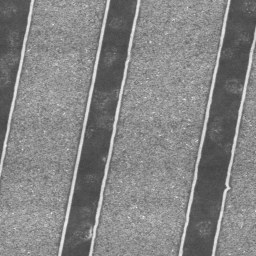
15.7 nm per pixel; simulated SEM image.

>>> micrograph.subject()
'one or a few lines or trenches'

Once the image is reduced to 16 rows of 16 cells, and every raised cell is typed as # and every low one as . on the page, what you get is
##.....##.....##
##....##......##
##....##......##
#.....##......##
#.....##.....###
#.....##.....##.
#.....#......##.
#....##......##.
.....##......##.
.....##.....###.
.....##.....##..
.....#......##..
....##......##..
....##......##..
....##......##..
....##.....##...